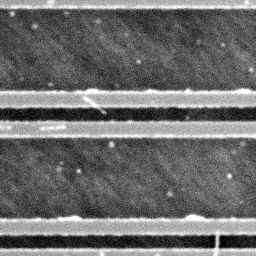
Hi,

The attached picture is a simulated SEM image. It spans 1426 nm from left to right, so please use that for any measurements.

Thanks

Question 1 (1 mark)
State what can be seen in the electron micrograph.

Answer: lines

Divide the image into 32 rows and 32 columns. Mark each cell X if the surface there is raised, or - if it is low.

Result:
XXXXXXXXXXXXXXXXXXXXXXXXXXXXXXXX
--------------------------------
--------------------------------
--------------------------------
--------------------------------
--------------------------------
--------------------------------
--------------------------------
--------------------------------
--------------------------------
--------------------------------
XXXXXXXXXXXXXXXXXXXXXXXXXXXXXXXX
XXXXXXXXXXXXXXXXXXXXXXXXXXXXXXXX
--------------------------------
--------------------------------
XXXXXXXXXXXXXXXXXXXXXXXXXXXXXXXX
XXXXXXXXXXXXXXXXXXXXXXXXXXXXXXXX
--------------------------------
--------------------------------
--------------------------------
--------------------------------
--------------------------------
--------------------------------
--------------------------------
--------------------------------
--------------------------------
--------------------------------
XXXXXXXXXXXXXXXXXXXXXXXXXXXXXXXX
XXXXXXXXXXXXXXXXXXXXXXXXXXXXXXXX
---------------------------X----
--------------------------------
XXXXXXXXXXXXXXXXXXXXXXXXXXXXXXXX